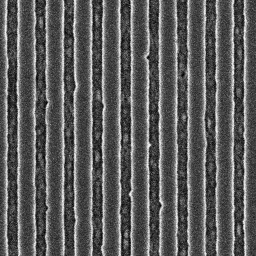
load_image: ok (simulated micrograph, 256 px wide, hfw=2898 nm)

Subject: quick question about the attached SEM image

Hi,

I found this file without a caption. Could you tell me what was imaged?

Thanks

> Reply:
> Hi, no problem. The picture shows parallel lines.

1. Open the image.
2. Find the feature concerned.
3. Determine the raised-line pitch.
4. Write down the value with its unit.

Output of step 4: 321 nm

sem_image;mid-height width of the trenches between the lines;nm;132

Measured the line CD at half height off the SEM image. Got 197 nm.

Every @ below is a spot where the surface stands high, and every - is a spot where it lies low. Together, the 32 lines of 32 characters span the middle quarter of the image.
---@@@@---@@@@---@@@@---@@@@---@
---@@@@---@@@@---@@@@---@@@@---@
---@@@@---@@@@---@@@@---@@@@---@
---@@@@---@@@@---@@@@---@@@@---@
---@@@@---@@@@---@@@@---@@@@---@
---@@@@---@@@@---@@@@---@@@@---@
---@@@@---@@@@---@@@@---@@@@---@
---@@@@---@@@@---@@@@---@@@@---@
---@@@@---@@@@---@@@@---@@@@---@
---@@@@---@@@@---@@@@---@@@@---@
---@@@@---@@@@---@@@@---@@@@---@
---@@@@---@@@@---@@@@---@@@@---@
---@@@@---@@@@---@@@@---@@@@---@
---@@@@---@@@@---@@@@---@@@@---@
---@@@@---@@@@---@@@@---@@@@---@
---@@@@---@@@@---@@@@---@@@@---@
---@@@@---@@@@---@@@@---@@@@---@
---@@@@---@@@@---@@@@---@@@@---@
---@@@@---@@@@---@@@@---@@@@---@
---@@@@---@@@@---@@@@---@@@@---@
---@@@@---@@@@---@@@@---@@@@---@
---@@@@---@@@@---@@@@---@@@@---@
---@@@@---@@@@---@@@@---@@@@---@
---@@@@---@@@@---@@@@---@@@@---@
---@@@@---@@@@---@@@@---@@@@---@
---@@@@---@@@@---@@@@---@@@@---@
---@@@@---@@@@---@@@@---@@@@---@
---@@@@---@@@@---@@@@---@@@@---@
---@@@@---@@@@---@@@@---@@@@---@
---@@@@---@@@@---@@@@---@@@@---@
---@@@@---@@@@---@@@@---@@@@---@
---@@@@---@@@@---@@@@---@@@@---@